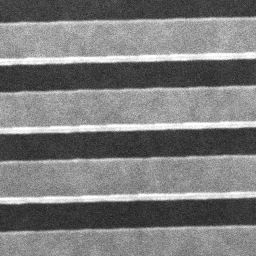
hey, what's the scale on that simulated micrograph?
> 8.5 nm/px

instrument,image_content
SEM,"lines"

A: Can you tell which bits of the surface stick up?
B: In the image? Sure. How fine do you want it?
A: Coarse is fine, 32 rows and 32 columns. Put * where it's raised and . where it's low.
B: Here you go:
................................
................................
.....................***********
********************************
********************************
********************************
********************************
********************............
................................
................................
................................
......**************************
********************************
********************************
********************************
********************************
****............................
................................
................................
................................
********************************
********************************
********************************
********************************
********************************
................................
................................
................................
......................**********
********************************
********************************
********************************